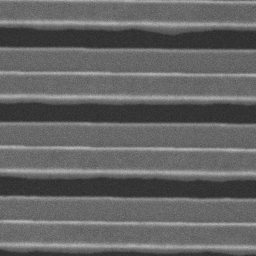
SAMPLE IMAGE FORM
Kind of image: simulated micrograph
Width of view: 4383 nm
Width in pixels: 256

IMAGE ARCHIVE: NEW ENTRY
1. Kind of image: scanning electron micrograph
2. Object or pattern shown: lines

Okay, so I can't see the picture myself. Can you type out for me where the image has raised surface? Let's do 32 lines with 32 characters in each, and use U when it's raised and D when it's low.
UUUUUUUUUUUUUUUUUUUUUUUUUUUUUUUU
UUUUUUUUUUUUUUUUUUUUUUUUUUUUUUUU
UUUUUUUUUUUUUUUUUUUUUUUUUUUUUUUU
DDDDDDDDDDDDDDDDDDDDUUUDDDDDDDDD
DDDDDDDDDDDDDDDDDDDDDDDDDDDDDDDD
DDDDDDDDDDDDDDDDDDDDDDDDDDDDDDDD
UUUUUUUUUUUUUUUUUUUUUUUUUUUUUUUU
UUUUUUUUUUUUUUUUUUUUUUUUUUUUUUUU
UUUUUUUUUUUUUUUUUUUUUUUUUUUUUUUU
UUUUUUUUUUUUUUUUUUUUUUUUUUUUUUUU
UUUUUUUUUUUUUUUUUUUUUUUUUUUUUUUU
UUUUUUUUUUUUUUUUUUUUUUUUUUUUUUUU
DDDDDDUUUUDDUUUUUUUUUUUUUUUUUUUU
DDDDDDDDDDDDDDDDDDDDDDDDDDDDDDDD
DDDDDDDDDDDDDDDDDDDDDDDDDDDDDDDD
UUUUUUUUUUUUUUDDDDDDDDDDDDDDDDDD
UUUUUUUUUUUUUUUUUUUUUUUUUUUUUUUU
UUUUUUUUUUUUUUUUUUUUUUUUUUUUUUUU
UUUUUUUUUUUUUUUUUUUUUUUUUUUUUUUU
UUUUUUUUUUUUUUUUUUUUUUUUUUUUUUUU
UUUUUUUUUUUUUUUUUUUUUUUUUUUUUUUU
UUUUUUUUUUUUUUUUUUUUUUUUUUUUUUUU
DDDDDDDDDDDDDDDDDDDDDDDDDDDDDDDD
DDDDDDDDDDDDDDDDDDDDDDDDDDDDDDDD
DDDDDDDDDDDDDDDDDDDDDDDDDDDDDDDD
UUUUUUUUUUUUUUUUUUUUUUUUUUUUUUUU
UUUUUUUUUUUUUUUUUUUUUUUUUUUUUUUU
UUUUUUUUUUUUUUUUUUUUUUUUUUUUUUUU
UUUUUUUUUUUUUUUUUUUUUUUUUUUUUUUU
UUUUUUUUUUUUUUUUUUUUUUUUUUUUUUUU
UUUUUUUUUUUUUUUUUUUUUUUUUUUUUUUU
DDDDDDDDDDDDDDDDDDDDDDDDDDDDDDDD